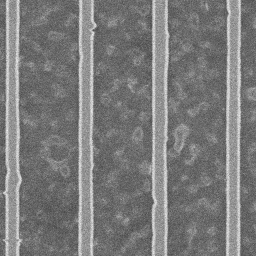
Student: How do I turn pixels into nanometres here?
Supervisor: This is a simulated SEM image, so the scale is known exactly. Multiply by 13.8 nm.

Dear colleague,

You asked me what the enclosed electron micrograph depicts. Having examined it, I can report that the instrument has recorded one or a few lines or trenches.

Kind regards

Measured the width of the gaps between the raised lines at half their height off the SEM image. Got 0.866 microns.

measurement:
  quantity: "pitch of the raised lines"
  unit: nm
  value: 1020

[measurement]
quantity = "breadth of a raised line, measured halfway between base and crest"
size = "154 nanometres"